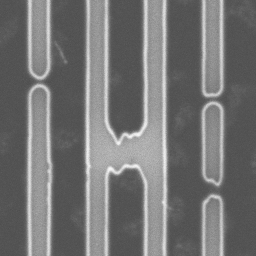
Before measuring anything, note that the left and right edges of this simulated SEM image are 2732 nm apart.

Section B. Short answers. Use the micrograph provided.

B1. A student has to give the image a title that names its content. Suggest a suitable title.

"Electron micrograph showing parallel lines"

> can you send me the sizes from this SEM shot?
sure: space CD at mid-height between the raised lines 188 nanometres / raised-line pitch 621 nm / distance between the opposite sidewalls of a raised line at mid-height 40.6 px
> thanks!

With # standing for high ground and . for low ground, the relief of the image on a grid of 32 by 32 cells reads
####..#####..#####...#####..####
####..#####..#####...#####..####
####..#####..#####..######..####
####..#####..#####...#####..####
####..#####..#####...#####..####
####..#####..#####...#####..####
####..#####..#####...#####..####
####..#####..#####...#####..####
####..#####..#####...####...####
###########..#####...####...####
###########..#####...####...####
####..#####..#####...#####.#####
####..#####..#####...###########
####..#####..#####...#####.#####
####..#####..#####...####...####
####..#####..#####...####...####
####..#####...####...#####..####
####..#####...#......#####..####
####..#####..........#####..####
####..#####..........#####..####
####..#####..........#####..####
####..#####...####...#####..####
####..#####..#####...#####..####
####..#####..#####...###########
####..#####..#####...###########
####..#####..#####..######..####
####..#####..#####...#####..####
####..#####..#####...#####..####
####..#####..#####...#####..####
####..#####..#####...####...####
####..#####..#####...#####..####
####..#####..#####...#####..####